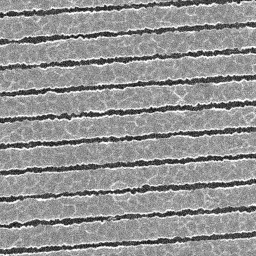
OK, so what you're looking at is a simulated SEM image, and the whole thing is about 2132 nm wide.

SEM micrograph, parallel lines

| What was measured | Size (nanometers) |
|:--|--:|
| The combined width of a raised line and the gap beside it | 218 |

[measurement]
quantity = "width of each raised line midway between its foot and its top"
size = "174 nm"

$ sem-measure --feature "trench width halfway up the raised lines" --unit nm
41.5